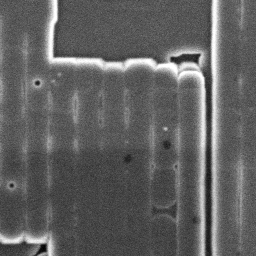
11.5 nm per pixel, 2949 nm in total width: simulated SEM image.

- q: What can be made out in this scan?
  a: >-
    wiring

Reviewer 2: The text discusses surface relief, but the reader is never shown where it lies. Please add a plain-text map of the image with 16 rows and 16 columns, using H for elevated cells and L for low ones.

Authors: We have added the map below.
HHHLLLLLLLLLLHHH
HHHLLLLLLLLLLHHH
HHHLLLLLLLLLLHHH
HHHLLLLLLLLLLHHH
HHHHHHHHHHHHLHHH
HHHHHHHHHHHHHHHH
HHHHHHHHHHHHHHHH
HHHHHHHHHHHHHHHH
HHHHHHHHHHHHHHHH
HHHHHHHHHHHHHHHH
HHHHHHHHHHHHHHHH
HHHHHHHHHHHHHHHH
HHHHHHHHHHHHHHHH
HHHHHHHHHHHHHHHH
HHHHHHHHHHHHHHHH
LLLHHHHHHHHHHHHH